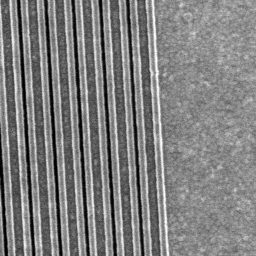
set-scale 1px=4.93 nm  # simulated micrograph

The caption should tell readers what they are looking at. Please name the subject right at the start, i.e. parallel lines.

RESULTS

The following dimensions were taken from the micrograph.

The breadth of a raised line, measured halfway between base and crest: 6.37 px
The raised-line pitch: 0.0679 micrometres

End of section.